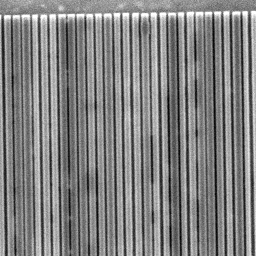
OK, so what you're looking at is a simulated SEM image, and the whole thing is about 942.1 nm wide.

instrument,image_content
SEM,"parallel lines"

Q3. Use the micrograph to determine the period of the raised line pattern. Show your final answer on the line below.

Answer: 0.0336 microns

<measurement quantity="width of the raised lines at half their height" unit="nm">21.6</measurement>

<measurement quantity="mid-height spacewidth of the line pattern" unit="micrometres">0.011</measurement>